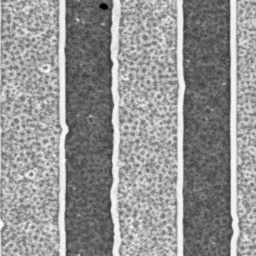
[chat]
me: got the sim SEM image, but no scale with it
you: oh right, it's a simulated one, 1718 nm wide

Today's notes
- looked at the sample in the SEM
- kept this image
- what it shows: one or a few lines or trenches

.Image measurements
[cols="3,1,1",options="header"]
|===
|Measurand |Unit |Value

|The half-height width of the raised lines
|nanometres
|442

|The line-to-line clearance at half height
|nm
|351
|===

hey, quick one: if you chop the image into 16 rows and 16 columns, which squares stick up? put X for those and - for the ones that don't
XXXX---XXXX----X
XXXX---XXXX----X
XXXX---XXXX----X
XXXX---XXXX----X
XXXX---XXXX----X
XXXX---XXXX----X
XXXX---XXXX----X
XXXX---XXXX----X
XXXX---XXXX----X
XXXX---XXXX----X
XXXX---XXXX----X
XXXX---XXXX----X
XXXX---XXXX----X
XXXX---XXXX----X
XXXX---XXXX----X
XXXX---XXXX----X